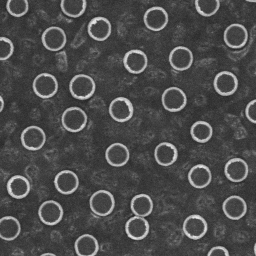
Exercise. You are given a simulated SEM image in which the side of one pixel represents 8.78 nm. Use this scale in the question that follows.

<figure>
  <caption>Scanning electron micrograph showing a regular array of raised bodies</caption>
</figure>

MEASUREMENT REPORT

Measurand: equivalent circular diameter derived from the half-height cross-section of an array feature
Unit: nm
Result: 199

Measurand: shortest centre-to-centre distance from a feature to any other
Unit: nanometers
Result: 367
